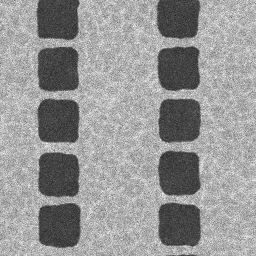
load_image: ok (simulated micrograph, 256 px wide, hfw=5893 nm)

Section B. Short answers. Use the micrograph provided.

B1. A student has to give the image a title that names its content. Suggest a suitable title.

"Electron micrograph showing a regular array of holes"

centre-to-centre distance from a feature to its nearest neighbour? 1190 nm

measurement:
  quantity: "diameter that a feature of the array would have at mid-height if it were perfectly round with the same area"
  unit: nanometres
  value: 1070